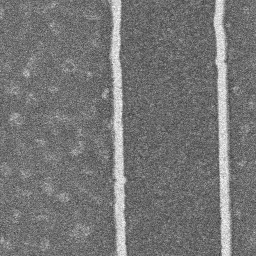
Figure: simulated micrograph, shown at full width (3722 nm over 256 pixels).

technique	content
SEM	one or a few lines or trenches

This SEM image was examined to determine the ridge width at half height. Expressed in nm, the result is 1530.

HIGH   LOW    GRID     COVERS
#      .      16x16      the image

.......#######..
.......#######..
.......#######..
.......#######..
.......#######..
.......#######..
.......#######..
.......#######..
.......#######..
.......#######..
.......#######..
.......#######..
.......#######..
........######..
........######..
........######..